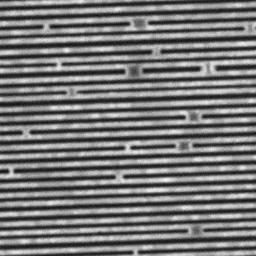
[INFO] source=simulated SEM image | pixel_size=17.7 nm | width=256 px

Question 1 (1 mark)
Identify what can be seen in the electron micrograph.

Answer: parallel lines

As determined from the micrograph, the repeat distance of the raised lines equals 169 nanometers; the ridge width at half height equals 75.2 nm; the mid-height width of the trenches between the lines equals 5.12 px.